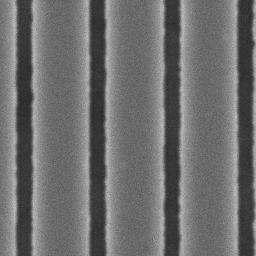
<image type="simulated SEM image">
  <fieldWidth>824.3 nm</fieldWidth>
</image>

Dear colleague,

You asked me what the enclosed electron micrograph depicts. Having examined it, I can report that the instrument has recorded lines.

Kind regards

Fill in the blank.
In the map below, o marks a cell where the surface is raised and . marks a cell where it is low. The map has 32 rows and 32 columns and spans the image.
oo..ooooooo..ooooooo...ooooooo..
oo..ooooooo..ooooooo...ooooooo..
oo..ooooooo..ooooooo...ooooooo..
oo..ooooooo..ooooooo...ooooooo..
oo..ooooooo..ooooooo...ooooooo..
oo..ooooooo..ooooooo...ooooooo..
oo..ooooooo..ooooooo...ooooooo..
oo..ooooooo..ooooooo...ooooooo..
oo..ooooooo..ooooooo...ooooooo..
oo..ooooooo..ooooooo...ooooooo..
oo..ooooooo..ooooooo...ooooooo..
oo..ooooooo..ooooooo...ooooooo..
oo..ooooooo..ooooooo...ooooooo..
oo..ooooooo..ooooooo...ooooooo..
oo..ooooooo..ooooooo...ooooooo..
oo..ooooooo..ooooooo...ooooooo..
oo..ooooooo..ooooooo...ooooooo..
oo..ooooooo..ooooooo...ooooooo..
oo..ooooooo..ooooooo...ooooooo..
oo..ooooooo..ooooooo...ooooooo..
oo..ooooooo..ooooooo...ooooooo..
oo..ooooooo..ooooooo...ooooooo..
oo..ooooooo..ooooooo...ooooooo..
oo..ooooooo..ooooooo...ooooooo..
oo..ooooooo..ooooooo...ooooooo..
oo..ooooooo..ooooooo...ooooooo..
oo..ooooooo..ooooooo...ooooooo..
oo..ooooooo..ooooooo...ooooooo..
oo..ooooooo..ooooooo...ooooooo..
oo..ooooooo..ooooooo...ooooooo..
oo..ooooooo..ooooooo...ooooooo..
oo..ooooooo..ooooooo...ooooooo..